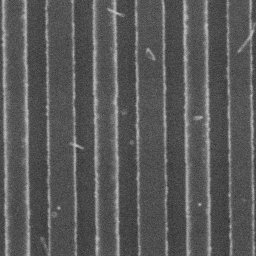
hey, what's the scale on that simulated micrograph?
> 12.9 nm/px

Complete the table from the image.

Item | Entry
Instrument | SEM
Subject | lines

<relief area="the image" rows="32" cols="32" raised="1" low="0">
11100011100011000111000111001110
11100011100011000111000111001110
11100011100011000111000111001110
11100011100011000111000111001110
11100011100011000111000111001110
11100011100011000111100111001110
11100011100011000111000111001110
01100011100011000111000111000110
01100011100011100111100111001110
01100011100011100111100111001110
01100011100011100111100111000110
01100011100011100111100111000110
01100011100011100111100111000110
01100011100011100111100111000110
01100011100011100111100111000111
01100011100011100111100111000111
01100011100011100111100111000111
01100011100011100111100111000111
01100011110011100111100111000111
01100011100011100111100111000111
01100011100011100111100111000111
01100011100011100111100111000111
01100011100011100111100111000111
01100011100011100111100111000111
01100011100011100111100111000111
01100011100011100111100111000111
01110011100011100111100111000111
01110011100011100111100111000111
01110011100011100111100111000111
01110011100011100111100011000111
01110011100011100111100011000111
01110011100011100111100011000111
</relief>